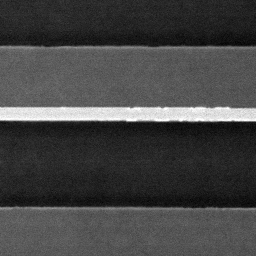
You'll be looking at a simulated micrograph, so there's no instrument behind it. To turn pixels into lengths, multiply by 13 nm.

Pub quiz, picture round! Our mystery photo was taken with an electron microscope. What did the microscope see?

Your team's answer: lines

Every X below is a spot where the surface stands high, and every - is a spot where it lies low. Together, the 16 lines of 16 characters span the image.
----------------
----------------
----------------
XXXXXXXXXXXXXXXX
XXXXXXXXXXXXXXXX
XXXXXXXXXXXXXXXX
XXXXXXXXXXXXXXXX
------XXXXXXXXXX
----------------
----------------
----------------
----------------
----------------
XXXXXXXXXXXXXXXX
XXXXXXXXXXXXXXXX
XXXXXXXXXXXXXXXX